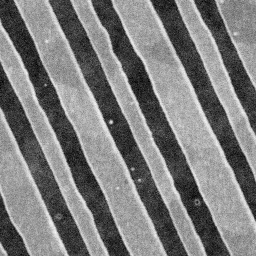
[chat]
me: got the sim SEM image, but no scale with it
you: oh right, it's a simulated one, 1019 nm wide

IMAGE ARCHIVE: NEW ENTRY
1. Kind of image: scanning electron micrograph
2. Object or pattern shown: lines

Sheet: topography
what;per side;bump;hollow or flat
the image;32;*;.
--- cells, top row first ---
..****...**...*****...**...*****
..*****..***...****...***..*****
...****...**...*****...**...****
...*****...**...****...***..****
*...****...***..*****...***..***
**..*****..***..*****...***..***
**...****...**...*****...**...**
***..****...***...****...***..**
***...****...**...*****...**...*
.**...****...***...****...***..*
.***...****...**...*****...**...
..**...****...***..*****...**...
..***...****...**...*****..***..
...**...****...**...*****...**..
...***..*****...**...*****..***.
*...**...****...**...*****...**.
*...***..*****..***...*****..***
**...**...****...**...*****...**
**...***..*****..***...*****..**
***...**...****...**...*****...*
***...**...*****..***...*****..*
****...**...****...**...*****...
****...**...****...***..*****...
*****...**...****...**...*****..
*****...**...****...**...*****..
.****...***..*****...**...*****.
.*****...**...****...**...*****.
.*****...***..*****...**...*****
..*****...**...****...**...*****
...****...**...*****..***...****
...*****...**...****...**...****
*...****...**...*****..***...***